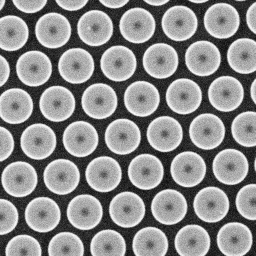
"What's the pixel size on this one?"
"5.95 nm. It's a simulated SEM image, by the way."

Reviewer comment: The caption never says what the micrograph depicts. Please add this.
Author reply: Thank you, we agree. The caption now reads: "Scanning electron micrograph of an array of small figures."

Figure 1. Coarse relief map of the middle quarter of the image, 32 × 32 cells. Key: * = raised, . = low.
*******..*********..********...*
*******...********..********...*
*******...*******....******.....
******.....*****.......*........
.****.............**.......*****
.......****.....******....******
*.....******....*******...******
**...********..*********..******
**...********..*********..******
***..********..*********..******
***..********...*******...******
**...********...*******....*****
**....******.....*****..........
*.......**..............***.....
...**.......*****.....******....
.******....*******...********...
********...********..********..*
********..*********..********..*
********..*********..********...
********..*********..********...
********...*******....******....
.******.....*****......****.....
..*****......**..............***
.........***......*****.....****
**.....******....*******...*****
***...********..********...*****
***...********..*********..*****
****.*********..*********..*****
****..********..********...*****
****..********...*******....****
***....******.....*****.......**
**......****.............**.....